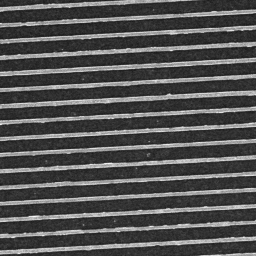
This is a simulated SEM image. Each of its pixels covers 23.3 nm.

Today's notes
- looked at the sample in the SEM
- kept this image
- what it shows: parallel lines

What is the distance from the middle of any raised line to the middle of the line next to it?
378 nm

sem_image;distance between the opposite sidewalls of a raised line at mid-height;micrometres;0.0815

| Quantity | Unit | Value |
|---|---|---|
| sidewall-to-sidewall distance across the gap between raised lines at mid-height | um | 0.3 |